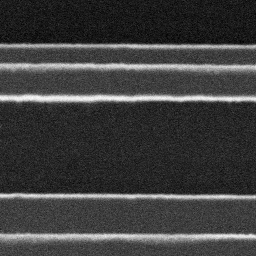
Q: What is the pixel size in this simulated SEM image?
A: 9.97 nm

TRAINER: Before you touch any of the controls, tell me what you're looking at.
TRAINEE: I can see lines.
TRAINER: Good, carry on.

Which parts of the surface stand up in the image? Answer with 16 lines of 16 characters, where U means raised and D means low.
DDDDDDDDDDDDDDDD
DDDDDDDDDDDDDDDD
DDDDDDDDDDDDDDDD
UUUUUUUUUUUUUUUU
UUUUUUUUUUUUUUUU
UUUUUUUUUUUUUUUU
DDDDDDDDDDDDDDDD
DDDDDDDDDDDDDDDD
DDDDDDDDDDDDDDDD
DDDDDDDDDDDDDDDD
DDDDDDDDDDDDDDDD
DDDDDDDDDDDDDDDD
UUUUUUUUUUUUUUUU
UUUUUUUUUUUUUUUU
UUUUUUUUUUUUUUUU
UUUUUUUUUUUUUUUU